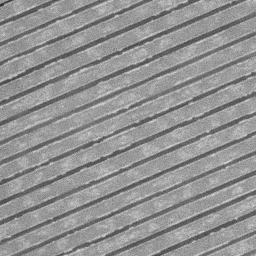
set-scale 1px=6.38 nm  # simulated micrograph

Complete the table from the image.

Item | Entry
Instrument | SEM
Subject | parallel lines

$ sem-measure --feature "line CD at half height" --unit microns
0.0879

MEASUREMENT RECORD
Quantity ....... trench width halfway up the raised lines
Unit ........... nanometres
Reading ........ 29.3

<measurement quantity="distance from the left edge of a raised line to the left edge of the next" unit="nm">116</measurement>